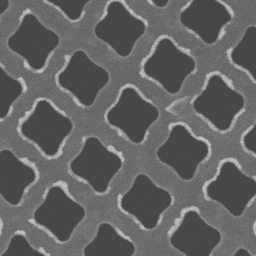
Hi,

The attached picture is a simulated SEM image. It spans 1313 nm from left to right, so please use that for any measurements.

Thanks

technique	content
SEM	a regular array of holes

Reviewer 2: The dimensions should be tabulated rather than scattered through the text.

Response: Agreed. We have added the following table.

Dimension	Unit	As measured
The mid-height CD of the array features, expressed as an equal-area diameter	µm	0.233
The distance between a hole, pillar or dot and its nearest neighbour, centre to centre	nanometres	314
